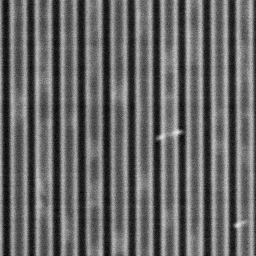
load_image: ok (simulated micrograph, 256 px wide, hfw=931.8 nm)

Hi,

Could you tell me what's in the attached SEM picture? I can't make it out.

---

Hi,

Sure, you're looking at parallel lines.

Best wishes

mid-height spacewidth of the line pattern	34.2	nm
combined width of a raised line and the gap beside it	91.6	nm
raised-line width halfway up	0.056	µm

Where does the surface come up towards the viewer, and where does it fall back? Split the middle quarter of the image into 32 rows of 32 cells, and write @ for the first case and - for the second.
@@@---@@@---@@@@--@@@@---@@@---@
@@@---@@@---@@@@--@@@@---@@@---@
@@@---@@@---@@@@--@@@@---@@@---@
@@@---@@@---@@@@--@@@@---@@@---@
@@@---@@@---@@@@--@@@@---@@@---@
@@@---@@@---@@@@--@@@@---@@@---@
@@@---@@@---@@@@--@@@@---@@@---@
@@@---@@@---@@@@--@@@@---@@@---@
@@@---@@@---@@@@--@@@@---@@@---@
@@@---@@@---@@@@--@@@@---@@@---@
@@@---@@@---@@@@--@@@@---@@@---@
@@@---@@@---@@@@--@@@@---@@@---@
@@@---@@@---@@@@--@@@@---@@@---@
@@@---@@@---@@@@--@@@@---@@@---@
@@@---@@@---@@@@--@@@@---@@@---@
@@@---@@@---@@@@--@@@@---@@@---@
@@@---@@@---@@@@--@@@@---@@@---@
@@@---@@@---@@@@--@@@@---@@@---@
@@@---@@@---@@@@--@@@@--@@@@---@
@@@---@@@---@@@@--@@@@---@@@---@
@@@---@@@---@@@@--@@@@---@@@---@
@@@---@@@---@@@@--@@@@---@@@---@
@@@---@@@---@@@@--@@@@---@@@---@
@@@---@@@---@@@@--@@@@---@@@---@
@@@---@@@---@@@@--@@@@---@@@---@
@@@---@@@---@@@@--@@@@---@@@---@
@@@---@@@---@@@@--@@@@---@@@---@
@@@---@@@@--@@@@--@@@@---@@@---@
@@@---@@@@--@@@@--@@@@---@@@---@
@@@---@@@@--@@@@--@@@@---@@@---@
@@@---@@@@--@@@@--@@@@---@@@---@
@@@---@@@@--@@@@--@@@@---@@@---@